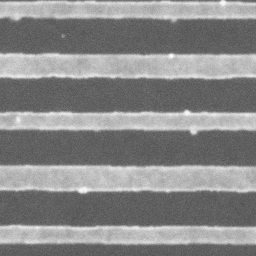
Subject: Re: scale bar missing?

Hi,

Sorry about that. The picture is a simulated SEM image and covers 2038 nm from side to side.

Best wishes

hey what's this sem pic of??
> lines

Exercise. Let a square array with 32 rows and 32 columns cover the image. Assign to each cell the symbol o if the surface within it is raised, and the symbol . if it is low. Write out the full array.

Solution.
oooooooooooooooooooooooooooooooo
oooooooooooooooooooooooooooooooo
................................
................................
................................
................................
................................
oooooooooooooooooooooooooooooooo
oooooooooooooooooooooooooooooooo
oooooooooooooooooooooooooooooooo
................................
................................
................................
................................
oooooooooooooooooooooooooooooooo
oooooooooooooooooooooooooooooooo
................................
................................
................................
................................
................................
oooooooooooooooooooooooooooooooo
oooooooooooooooooooooooooooooooo
oooooooooooooooooooooooooooooooo
................................
................................
................................
................................
oooooooooooooooooooooooooooooooo
oooooooooooooooooooooooooooooooo
................................
................................